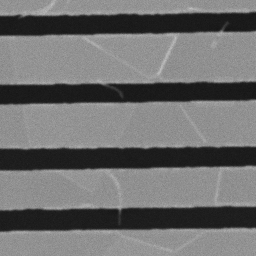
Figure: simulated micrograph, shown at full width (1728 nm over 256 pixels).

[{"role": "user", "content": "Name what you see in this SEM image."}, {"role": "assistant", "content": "lines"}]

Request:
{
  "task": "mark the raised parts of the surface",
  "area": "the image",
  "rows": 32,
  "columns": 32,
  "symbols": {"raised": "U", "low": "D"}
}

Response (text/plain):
UUUUUUUUUUUUUUUUUUUUUUUUUUUUUUUU
UUUUUUUUUUUUUUUUUUUUUUUUUUUUUUUU
DDDDDDDDDDDDDDDDDDDDDDDDDDDDDDDD
DDDDDDDDDDDDDDDDDDDDDDDDDDDDDDDD
DDDDDUUUUUUUUUUUUUUUUUUUUUUUUUUU
UUUUUUUUUUUUUUUUUUUUUUUUUUUUUUUU
UUUUUUUUUUUUUUUUUUUUUUUUUUUUUUUU
UUUUUUUUUUUUUUUUUUUUUUUUUUUUUUUU
UUUUUUUUUUUUUUUUUUUUUUUUUUUUUUUU
UUUUUUUUUUUUUUUUUUUUUUUUUUUUUUUU
DDDDDDDDDDDDDDDDDDDDDDDDDDDDDDDD
DDDDDDDDDDDDDDDDDDDDDDDDDDDDDDDD
DDDDDDDDDDDDDDDDDDDDDDDDDDDDDDDD
UUUUUUUUUUUUUUUUUUUUUUUUUUUUUUUU
UUUUUUUUUUUUUUUUUUUUUUUUUUUUUUUU
UUUUUUUUUUUUUUUUUUUUUUUUUUUUUUUU
UUUUUUUUUUUUUUUUUUUUUUUUUUUUUUUU
UUUUUUUUUUUUUUUUUUUUUUUUUUUUUUUU
DDUUDDDDDDDDDDDDDDDDDDDDDDDDDDDD
DDDDDDDDDDDDDDDDDDDDDDDDDDDDDDDD
DDDDDDDDDDDDDDDDDDDDDDDDDDDDDDDD
UUUUUUUUUUUUUUUUUUUUUUUUUUUUUUUU
UUUUUUUUUUUUUUUUUUUUUUUUUUUUUUUU
UUUUUUUUUUUUUUUUUUUUUUUUUUUUUUUU
UUUUUUUUUUUUUUUUUUUUUUUUUUUUUUUU
UUUUUUUUUUUUUUUUUUUUUUUUUUUUUUUU
DDDDDDDDDDDDDDDDDDDDDDDDDDDDDDDD
DDDDDDDDDDDDDDDDDDDDDDDDDDDDDDDD
DDDDDDDDDDDDDDDDDDDDDDDDDDDDDDDD
UUUUUUUUUUUUUUUUUUUUUUUUUUUUUUUU
UUUUUUUUUUUUUUUUUUUUUUUUUUUUUUUU
UUUUUUUUUUUUUUUUUUUUUUUUUUUUUUUU